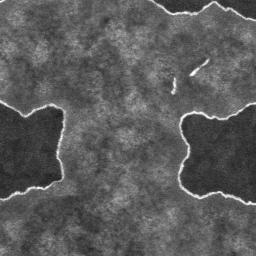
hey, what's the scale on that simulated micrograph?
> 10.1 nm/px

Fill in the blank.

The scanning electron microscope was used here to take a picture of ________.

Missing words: raised bodies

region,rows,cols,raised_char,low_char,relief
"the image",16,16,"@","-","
----------@@@-@@
----------------
----------------
----------------
----------------
----------------
----------------
@@@@-------@@@@@
@@@@-------@@@@@
@@@@--------@@@@
@@@@-------@@@@@
@@@--------@@@@@
---------------@
----------------
----------------
----------------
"